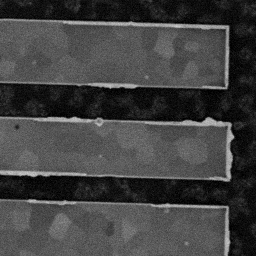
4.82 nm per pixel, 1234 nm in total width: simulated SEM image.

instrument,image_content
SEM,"one or a few lines or trenches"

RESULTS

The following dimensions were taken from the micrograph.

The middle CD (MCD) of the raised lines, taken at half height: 0.288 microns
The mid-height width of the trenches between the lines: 0.145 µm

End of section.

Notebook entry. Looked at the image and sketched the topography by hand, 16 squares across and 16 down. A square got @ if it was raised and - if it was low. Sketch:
----------------
@@@@@@@@@@@-----
@@@@@@@@@@@@@@--
@@@@@@@@@@@@@@--
@@@@@@@@@@@@@@--
------------@@--
----------------
@@@@@@@------@--
@@@@@@@@@@@@@@--
@@@@@@@@@@@@@@--
@@@@@@@@@@@@@@--
----------------
@@--------------
@@@@@@@@@@@@@@--
@@@@@@@@@@@@@@--
@@@@@@@@@@@@@@--